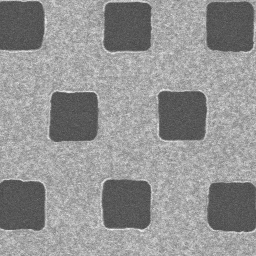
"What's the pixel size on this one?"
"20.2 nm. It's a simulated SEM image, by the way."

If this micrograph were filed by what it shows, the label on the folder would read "holes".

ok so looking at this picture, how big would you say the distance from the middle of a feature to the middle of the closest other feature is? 2070 nanometers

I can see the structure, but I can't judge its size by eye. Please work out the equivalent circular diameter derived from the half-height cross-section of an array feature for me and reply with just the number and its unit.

53.9 pixels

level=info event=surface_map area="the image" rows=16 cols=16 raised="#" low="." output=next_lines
...####..####...
...###...####...
...###...####...
################
################
################
###...####...###
###...####...###
###...####...###
################
################
..#####..####...
...###...####...
...###...####...
################
################